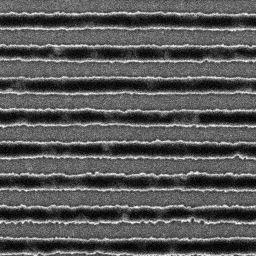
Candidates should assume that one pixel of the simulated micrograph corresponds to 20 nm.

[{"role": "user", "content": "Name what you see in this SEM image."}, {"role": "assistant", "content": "parallel lines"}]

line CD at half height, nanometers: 320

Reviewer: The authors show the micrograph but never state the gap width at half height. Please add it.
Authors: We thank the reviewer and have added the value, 323 nm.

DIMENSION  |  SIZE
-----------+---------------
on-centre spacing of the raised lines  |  643 nanometers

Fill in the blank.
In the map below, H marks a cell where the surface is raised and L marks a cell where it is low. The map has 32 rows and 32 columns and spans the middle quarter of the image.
LLLLLLLLLLLLLLLLLLLLLLLLLLLLLLLL
LLLLLLLLLLLLLLLLLLLLLLLLLLLLLLLL
LLLLLLLLLLLLLLLLLLLLLLLLLLLLLLLL
HLHHHHHHHHHHHHHHHHHHHHHHHLHHHLHH
HHHHHHHHHHHHHHHHHHHHHHHHHHHHHHHH
HHHHHHHHHHHHHHHHHHHHHHHHHHHHHHHH
HHHHHHHHHHHHHHHHHHHHHHHHHHHHHHHH
HHHHLHLLLLLLLLLLLLLLLHHLLLLLLLLL
LLLLLLLLLLLLLLLLLLLLLLLLLLLLLLLL
LLLLLLLLLLLLLLLLLLLLLLLLLLLLLLLL
LLLLLLLLLLLLLLLLLLLLLLLLLLLLLLLL
HHHHHHHHLLLLLLLLLLHLLLLLLLLLLLLL
HHHHHHHHHHHHHHHHHHHHHHHHHHHHHHHH
HHHHHHHHHHHHHHHHHHHHHHHHHHHHHHHH
HHHHHHHHHHHHHHHHHHHHHHHHHHHHHHHH
LLLLLLLLLLLLLLLLLLLLHLLLLLHLLLHL
LLLLLLLLLLLLLLLLLLLLLLLLLLLLLLLL
LLLLLLLLLLLLLLLLLLLLLLLLLLLLLLLL
LLLLLLLLLLLLLLLLLLLLLLLLLLLLLLLL
LLLHLLLLLHLLHHLHLHHLLLHHHHHHHHLL
HHHHHHHHHHHHHHHHHHHHHHHHHHHHHHHH
HHHHHHHHHHHHHHHHHHHHHHHHHHHHHHHH
HHHHHHHHHHHHHHHHHHHHHHHHHHHHHHHH
LLLLLLLLLLLLHLLLLLLLLHHHHHHHHHHH
LLLLLLLLLLLLLLLLLLLLLLLLLLLLLLLL
LLLLLLLLLLLLLLLLLLLLLLLLLLLLLLLL
LLLLLLLLLLLLLLLLLLLLLLLLLLLLLLLL
LLLLLHHLHHHHHLLLLLLHLLLLLLLLLLLH
HHHHHHHHHHHHHHHHHHHHHHHHHHHHHHHH
HHHHHHHHHHHHHHHHHHHHHHLHHHHHHHHH
HHHHHHHHHHHHHHHHHHHHHHHHHHHHHHHH
LLHLHLLLHHHHHHHHHHHHHLHHHLLLLHHH